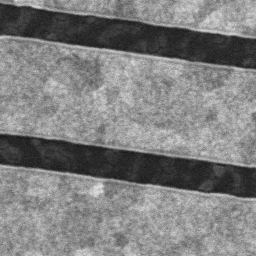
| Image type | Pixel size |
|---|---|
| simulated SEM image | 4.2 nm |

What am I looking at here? one or a few lines or trenches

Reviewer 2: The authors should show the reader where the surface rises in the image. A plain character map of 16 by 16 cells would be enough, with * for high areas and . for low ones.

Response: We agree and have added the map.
...*************
..........******
**..............
*********.......
****************
****************
****************
****************
..**************
.........*******
*...............
********........
****************
****************
****************
****************